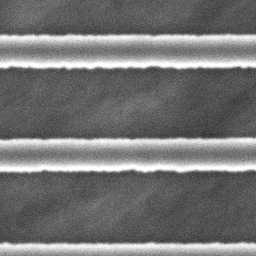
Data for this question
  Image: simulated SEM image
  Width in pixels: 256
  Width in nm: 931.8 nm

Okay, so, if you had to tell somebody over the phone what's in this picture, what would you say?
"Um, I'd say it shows lines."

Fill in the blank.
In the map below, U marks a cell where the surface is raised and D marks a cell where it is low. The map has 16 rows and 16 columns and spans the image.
DDDDDDDDDDDDDDDD
DDDDDDDDDDDDDDDD
UUUUUUUUUUUUUUUU
UUUUUUUUUUUUUUUU
DDDDDDDDDDDDDDDD
DDDDDDDDDDDDDDDD
DDDDDDDDDDDDDDDD
DDDDDDDDDDDDDDDD
DDDDDDDDDDDDDDDD
UUUUUUUUUUUUUUUU
UUUUUUUUUUUUUUUU
DDDDDDDDDDDDDDDD
DDDDDDDDDDDDDDDD
DDDDDDDDDDDDDDDD
DDDDDDDDDDDDDDDD
UUUUUUUUUUUUUUUU